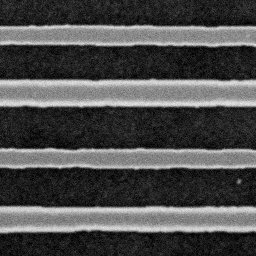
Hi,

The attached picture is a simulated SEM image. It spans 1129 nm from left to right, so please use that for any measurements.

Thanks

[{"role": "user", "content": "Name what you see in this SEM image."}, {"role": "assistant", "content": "lines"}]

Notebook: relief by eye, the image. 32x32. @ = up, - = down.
--------------------------------
--------------------------------
--------------------------------
@@@@@@@@@@@@@@@@@@@@@@@@@@-@@@@@
@@@@@@@@@@@@@@@@@@@@@@@@@@@@@@@@
@@@@@@@@@@@@@@@@@@@@@@@@@@@@@@@@
--------------------------------
--------------------------------
--------------------------------
--------------------------------
@@@@@@@@@@@@@@@@@@@@@@@@@@@@@@@@
@@@@@@@@@@@@@@@@@@@@@@@@@@@@@@@@
@@@@@@@@@@@@@@@@@@@@@@@@@@@@@@@@
--------------------------------
--------------------------------
--------------------------------
--------------------------------
--------------------------------
--------------------------------
@@@@@@@@@@@@@@@@@@@@@@@@@@@@@@@@
@@@@@@@@@@@@@@@@@@@@@@@@@@@@@@@@
--------------------------------
--------------------------------
--------------------------------
--------------------------------
--------------------------------
@@@@@@@@@@@@@@@@@@@@@@@@@@@@@@@@
@@@@@@@@@@@@@@@@@@@@@@@@@@@@@@@@
@@@@@@@@@@@@@@@@@@@@@@@@@@@@@@@@
--------------------------------
--------------------------------
--------------------------------